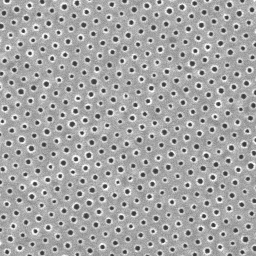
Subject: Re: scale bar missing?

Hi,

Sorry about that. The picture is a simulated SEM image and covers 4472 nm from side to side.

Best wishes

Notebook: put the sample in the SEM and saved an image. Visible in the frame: a regular array of holes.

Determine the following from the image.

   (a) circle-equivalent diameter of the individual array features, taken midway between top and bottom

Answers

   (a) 0.0836 um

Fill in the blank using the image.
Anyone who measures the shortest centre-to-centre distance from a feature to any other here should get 227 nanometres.